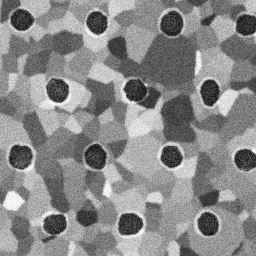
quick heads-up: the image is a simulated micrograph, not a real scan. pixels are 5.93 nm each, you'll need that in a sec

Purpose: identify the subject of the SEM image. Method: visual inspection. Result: a regular array of holes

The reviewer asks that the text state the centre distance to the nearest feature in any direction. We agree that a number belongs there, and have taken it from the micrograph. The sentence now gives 445 nanometres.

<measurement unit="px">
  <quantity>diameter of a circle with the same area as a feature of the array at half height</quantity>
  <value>24.6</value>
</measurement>